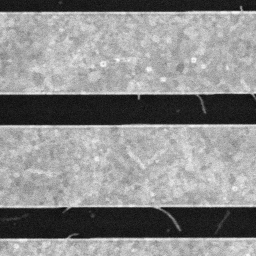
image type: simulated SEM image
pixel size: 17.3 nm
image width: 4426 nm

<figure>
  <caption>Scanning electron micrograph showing lines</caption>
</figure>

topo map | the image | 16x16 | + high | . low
................
++++++++++++++++
++++++++++++++++
++++++++++++++++
++++++++++++++++
++++++++++++++++
................
................
++++++++++++++++
++++++++++++++++
++++++++++++++++
++++++++++++++++
++++++++++++++++
................
................
++++++++++++++++